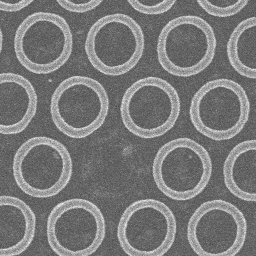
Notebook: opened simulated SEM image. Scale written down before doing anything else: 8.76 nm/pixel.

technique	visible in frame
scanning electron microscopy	ring-shaped raised bodies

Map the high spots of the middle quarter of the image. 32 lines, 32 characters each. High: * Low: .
........***..*****.......***....
.........*******..........******
...........***.............*****
.*****..............***.........
*********.........*******.......
**....***........***...****.....
.......***......***......***....
........***....**.........**....
.........**....**.........***...
.........**....*...........**...
.........**...**...........**...
.........**...**...........**..*
.........**...**...........**...
........**....***.........**....
.......***.....**........***....
*.....***......***......***.....
********........**********......
******............*******.......
....................*...........
..........................******
.........................*******
*.......................***.....
*......................***......
**.....................**.......
**....................***.......
**....................**........
**....................**........
**....................**........
*.....................***.......
*......................**.......
.......................***......
........................***.....